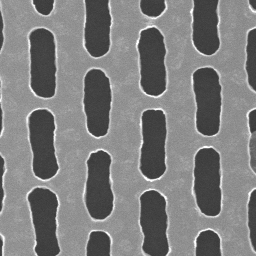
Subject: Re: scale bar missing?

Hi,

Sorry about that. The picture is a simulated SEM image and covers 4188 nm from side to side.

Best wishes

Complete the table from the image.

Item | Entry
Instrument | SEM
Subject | a regular array of holes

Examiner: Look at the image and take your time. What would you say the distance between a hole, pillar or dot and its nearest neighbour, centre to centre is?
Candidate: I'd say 1100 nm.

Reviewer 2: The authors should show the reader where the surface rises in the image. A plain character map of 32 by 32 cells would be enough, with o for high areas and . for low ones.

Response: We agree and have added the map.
oooo...oooo...ooo....ooo...oooo.
ooooo.ooooo...oooo..oooo...ooooo
ooooooooooo...oooooooooo...ooooo
ooooooooooo...oooooooooo...ooooo
oooo...oooo...oooo..oooo...oooo.
oooo...oooo...ooo....ooo...oooo.
oooo...oooo..oooo....oooo..oooo.
oooo...oooooooooo....oooooooooo.
oooo...ooooooooooo...oooo.ooooo.
oooo...oooo..ooooo...ooo...oooo.
oooo...oooo...oooo...ooo....ooo.
oooo...oooo...oooo..oooo....oooo
oooooooooo....ooooooooooo...oooo
ooooooooooo...ooooooooooo...oooo
oooo...oooo...oooo...oooo...ooo.
oooo...oooo...oooo...oooo..oooo.
oooo...oooo..ooooo...oooo..oooo.
oooo...ooooooooooo...oooooooooo.
oooo...ooooooooooo...oooooooooo.
oooo...oooo...oooo...ooo...oooo.
.ooo...oooo...ooo....ooo...oooo.
.ooo...oooo...oooo...ooo....oooo
ooooooooooo...oooooooooo....oooo
ooooo.ooooo...oooooooooo....oooo
oooo...oooo...oooo..oooo....ooo.
oooo...oooo...ooo....oooo...ooo.
oooo...oooo...oooo...oooo..oooo.
oooo...ooooooooooo...oooooooooo.
oooo...ooooooooooo...oooooooooo.
oooo...oooo...oooo...oooo..oooo.
oooo...oooo...oooo...ooo....ooo.
oooo...oooo...oooo...ooo....oooo